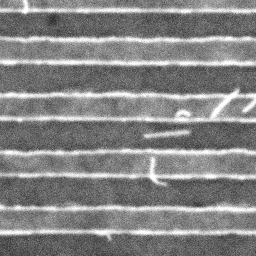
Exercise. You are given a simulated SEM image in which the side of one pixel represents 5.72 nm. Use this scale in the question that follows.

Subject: lines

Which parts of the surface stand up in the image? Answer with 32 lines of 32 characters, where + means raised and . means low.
++++++++++++++++++++++++++++++++
................................
................................
................................
................................
++++++++++++++++++++++++++++++++
++++++++++++++++++++++++++++++++
++++++++++++++++++++++++++++++++
................................
................................
................................
................................
++++++++++++++++++++++++++++++++
++++++++++++++++++++++++++++++++
++++++++++++++++++++++++++++++++
................................
................................
................................
................................
++++++++++++++++++++++++++++++++
++++++++++++++++++++++++++++++++
++++++++++++++++++++++++++++++++
................................
................................
................................
................................
++++++++++++++++++++++++++++++++
++++++++++++++++++++++++++++++++
++++++++++++++++++++++++++++++++
................................
................................
................................